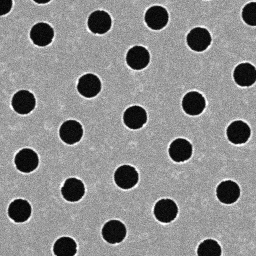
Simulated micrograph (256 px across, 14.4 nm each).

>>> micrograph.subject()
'a regular array of holes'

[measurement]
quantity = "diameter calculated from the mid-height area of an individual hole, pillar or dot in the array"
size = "348 nm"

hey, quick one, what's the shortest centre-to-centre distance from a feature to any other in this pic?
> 747 nm